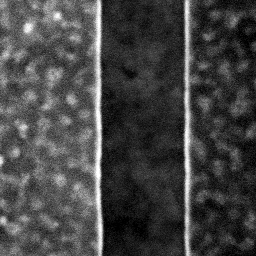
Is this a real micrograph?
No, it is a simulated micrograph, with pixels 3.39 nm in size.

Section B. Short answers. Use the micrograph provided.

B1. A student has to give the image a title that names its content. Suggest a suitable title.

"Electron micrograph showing one or a few lines or trenches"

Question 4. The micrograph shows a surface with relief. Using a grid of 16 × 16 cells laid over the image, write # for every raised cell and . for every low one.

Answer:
######......####
######......####
######......####
######......####
######......####
######......####
######......####
######......####
######......####
######......####
######......####
######......####
######......####
######......####
######......####
######......####